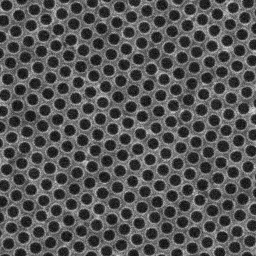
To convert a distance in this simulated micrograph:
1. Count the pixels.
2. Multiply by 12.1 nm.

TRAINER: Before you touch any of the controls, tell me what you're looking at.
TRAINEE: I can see a regular array of holes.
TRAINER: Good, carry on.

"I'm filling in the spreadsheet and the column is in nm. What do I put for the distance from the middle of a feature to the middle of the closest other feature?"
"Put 190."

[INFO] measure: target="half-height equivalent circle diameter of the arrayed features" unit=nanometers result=148